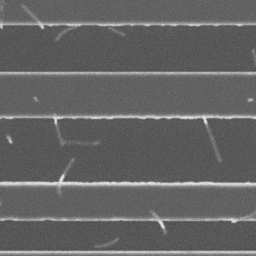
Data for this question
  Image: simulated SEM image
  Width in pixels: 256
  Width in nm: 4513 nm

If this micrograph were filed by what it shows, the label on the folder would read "lines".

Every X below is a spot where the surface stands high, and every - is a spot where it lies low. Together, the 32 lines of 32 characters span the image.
XXXXXXXXXXXXXXXXXXXXXXXXXXXXXXXX
XXXXXXXXXXXXXXXXXXXXXXXXXXXXXXXX
XXXXXXXXXXXXXXXXXXXXXXXXXXXXXXXX
--------------------------------
--------------------------------
--------------------------------
--------------------------------
--------------------------------
--------------------------------
XXXXXXXXXXXXXXXXXXXXXXXXXXXXXXXX
XXXXXXXXXXXXXXXXXXXXXXXXXXXXXXXX
XXXXXXXXXXXXXXXXXXXXXXXXXXXXXXXX
XXXXXXXXXXXXXXXXXXXXXXXXXXXXXXXX
XXXXXXXXXXXXXXXXXXXXXXXXXXXXXXXX
XXXXXXXXXXXXXXXXXXXXXXXXXXXXXXXX
--------------------------------
--------------------------------
--------------------------------
--------------------------------
--------------------------------
--------------------------------
--------------------------------
--------------------------------
XXXXXXXXXXXXXXXXXXXXXXXXXXXXXXXX
XXXXXXXXXXXXXXXXXXXXXXXXXXXXXXXX
XXXXXXXXXXXXXXXXXXXXXXXXXXXXXXXX
XXXXXXXXXXXXXXXXXXXXXXXXXXXXXXXX
XXXXXXXXXXXXXXXXXXXXXXXXXXXXXXXX
--------------------------------
--------------------------------
--------------------------------
XXXXXXXXXXXXXXXXXXXXXXXXXXXXXXXX